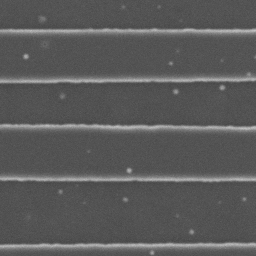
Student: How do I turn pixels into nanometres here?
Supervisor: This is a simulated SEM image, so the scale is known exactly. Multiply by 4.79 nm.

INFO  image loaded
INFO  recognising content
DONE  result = lines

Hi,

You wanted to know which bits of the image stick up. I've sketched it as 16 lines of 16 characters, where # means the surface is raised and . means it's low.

................
................
################
################
################
................
................
................
################
################
################
................
................
................
................
################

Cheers